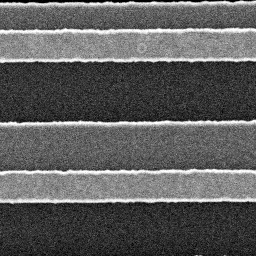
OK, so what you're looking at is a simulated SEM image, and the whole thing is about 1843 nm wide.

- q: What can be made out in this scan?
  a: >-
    lines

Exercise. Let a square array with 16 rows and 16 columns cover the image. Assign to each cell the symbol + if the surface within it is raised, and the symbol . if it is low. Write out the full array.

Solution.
++++++++++++++++
++++++++++++++++
++++++++++++++++
++++++++++++++++
................
................
................
................
++++++++++++++++
++++++++++++++++
++++++++++++++++
++++++++++++++++
++++++++++++++++
................
................
................